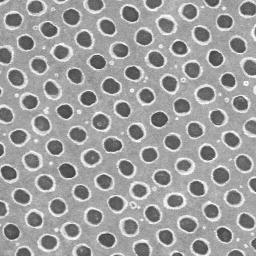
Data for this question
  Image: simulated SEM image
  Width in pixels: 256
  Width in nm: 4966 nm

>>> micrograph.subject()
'a regular array of holes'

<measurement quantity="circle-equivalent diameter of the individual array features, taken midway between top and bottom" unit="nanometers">313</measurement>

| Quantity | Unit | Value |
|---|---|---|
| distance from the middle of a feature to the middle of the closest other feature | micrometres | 0.498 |